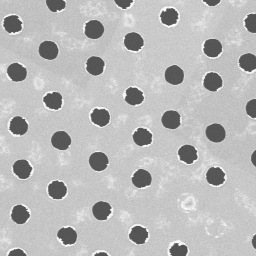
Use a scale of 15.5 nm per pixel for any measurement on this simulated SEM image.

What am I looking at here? a regular array of holes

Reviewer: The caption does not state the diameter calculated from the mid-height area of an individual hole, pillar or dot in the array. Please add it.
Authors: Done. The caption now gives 293 nm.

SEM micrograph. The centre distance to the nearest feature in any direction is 623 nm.